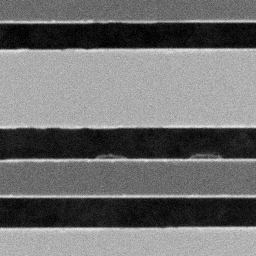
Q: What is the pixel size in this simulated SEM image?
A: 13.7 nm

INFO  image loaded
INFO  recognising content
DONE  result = lines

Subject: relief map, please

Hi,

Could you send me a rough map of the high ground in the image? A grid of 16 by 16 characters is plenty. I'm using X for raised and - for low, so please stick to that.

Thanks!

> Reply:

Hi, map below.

XXXXXXXXXXXXXXXX
----------------
----------------
XXXXXXXXXXXXXXXX
XXXXXXXXXXXXXXXX
XXXXXXXXXXXXXXXX
XXXXXXXXXXXXXXXX
XXXXXXXXXXXXXXXX
----------------
----------------
XXXXXXXXXXXXXXXX
XXXXXXXXXXXXXXXX
----------------
----------------
XXXXXXXXXXXXXXXX
XXXXXXXXXXXXXXXX